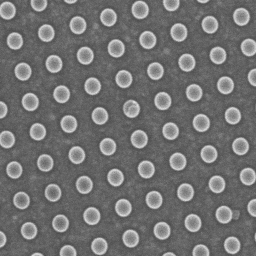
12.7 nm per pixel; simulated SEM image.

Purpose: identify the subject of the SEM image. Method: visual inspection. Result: a regular array of raised bodies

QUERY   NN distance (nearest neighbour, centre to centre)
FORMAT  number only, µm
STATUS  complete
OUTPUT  0.394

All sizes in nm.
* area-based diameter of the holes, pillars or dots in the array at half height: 205